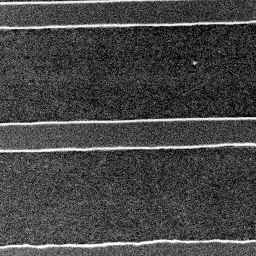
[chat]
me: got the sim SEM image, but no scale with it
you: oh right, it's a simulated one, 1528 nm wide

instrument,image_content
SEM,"one or a few lines or trenches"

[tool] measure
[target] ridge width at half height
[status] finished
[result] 166 nanometers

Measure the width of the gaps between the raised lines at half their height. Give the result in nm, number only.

563